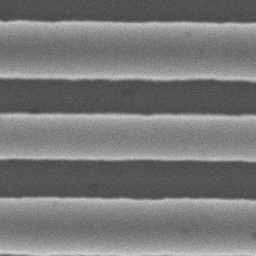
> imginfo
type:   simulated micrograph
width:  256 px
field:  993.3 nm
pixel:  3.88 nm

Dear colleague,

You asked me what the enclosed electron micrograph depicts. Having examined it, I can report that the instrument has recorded lines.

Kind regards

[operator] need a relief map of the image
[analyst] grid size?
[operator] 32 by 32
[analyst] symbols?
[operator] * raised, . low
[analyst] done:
................................
................................
................................
********************************
********************************
********************************
********************************
********************************
********************************
********************************
................................
................................
................................
................................
******************.**...........
********************************
********************************
********************************
********************************
********************************
................................
................................
................................
................................
................................
********************************
********************************
********************************
********************************
********************************
********************************
********************************